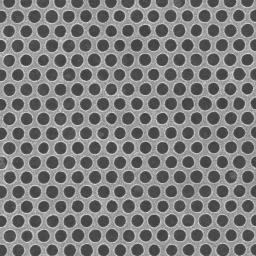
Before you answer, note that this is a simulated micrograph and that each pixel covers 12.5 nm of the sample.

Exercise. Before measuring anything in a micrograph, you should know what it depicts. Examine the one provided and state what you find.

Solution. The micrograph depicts a regular array of holes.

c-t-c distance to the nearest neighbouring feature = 205 nm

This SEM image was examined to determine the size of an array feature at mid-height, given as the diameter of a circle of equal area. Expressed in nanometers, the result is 152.